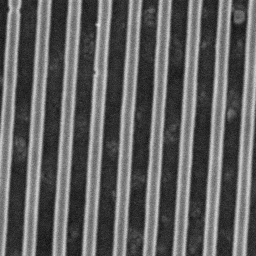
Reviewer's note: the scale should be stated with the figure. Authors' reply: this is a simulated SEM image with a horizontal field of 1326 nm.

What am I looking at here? parallel lines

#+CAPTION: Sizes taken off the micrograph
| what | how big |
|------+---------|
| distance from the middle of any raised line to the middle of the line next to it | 156 nanometres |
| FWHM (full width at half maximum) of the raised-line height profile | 60.7 nm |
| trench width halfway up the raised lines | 93.3 nanometres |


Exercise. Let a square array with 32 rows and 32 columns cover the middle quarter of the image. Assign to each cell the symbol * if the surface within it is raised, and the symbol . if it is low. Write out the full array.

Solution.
***.....***....***.....***.....*
***.....***....***.....***....**
***.....***....***.....***....**
***.....***....***.....***....**
***....***.....***.....***....**
***....***.....***.....***....**
***....***.....***.....**.....**
***....***.....***.....**.....**
***....***.....***.....**.....**
**.....***.....***.....**.....**
**.....***.....***....***.....**
**.....***....***.....***.....**
**.....***....***.....***.....**
**.....***....***.....***.....**
**.....***....***.....***....***
**.....***....***.....***....***
**.....***....***.....***....***
**.....***....***.....***....***
**.....***....***.....**.....***
**.....**.....***.....***....***
**....***.....***.....***....***
**....***.....***.....**.....***
**....***.....***....***.....***
**....***.....***....***.....***
**....***.....***....***.....***
**....***.....***....***.....***
*.....***.....**.....***.....***
*.....***.....**.....***.....***
*.....***.....**.....***.....**.
*.....***.....**.....***....***.
*.....***.....**.....***....***.
*.....***....***.....***....***.